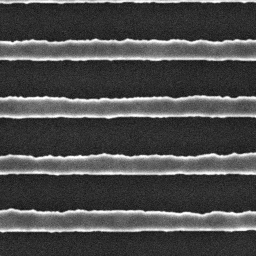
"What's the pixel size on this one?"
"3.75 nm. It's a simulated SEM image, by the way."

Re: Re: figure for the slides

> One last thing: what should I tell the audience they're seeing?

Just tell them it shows lines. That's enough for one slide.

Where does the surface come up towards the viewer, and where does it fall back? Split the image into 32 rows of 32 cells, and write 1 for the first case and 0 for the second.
00000000000000000000000000000000
00000000000000000000000000000000
00000000000000000000000000000000
00000000000000000000000000000000
00000000000000000000000000000000
11111111111111111111111111111111
11111111111111111111111111111111
01001111111001000011100000111111
00000000000000000000000000000000
00000000000000000000000000000000
00000000000000000000000000000000
00000000000000000000000000000000
11111111111111111111111111111111
11111111111111111111111111111111
11111111111111111111111111111111
00000000000000000000000000000000
00000000000000000000000000000000
00000000000000000000000000000000
00000000000000000000000000000000
11110000000111110111110001111111
11111111111111111111111111111111
11111111111111111111111111111111
00000000000000000000000000000000
00000000000000000000000000000000
00000000000000000000000000000000
00000000000000000000000000000000
11111110111111111111100000110001
11111111111111111111111111111111
11111111111111111111111111111111
00000000000000000000000000000000
00000000000000000000000000000000
00000000000000000000000000000000